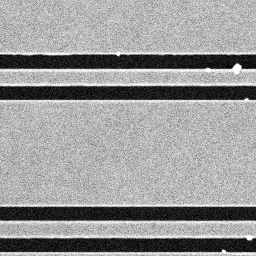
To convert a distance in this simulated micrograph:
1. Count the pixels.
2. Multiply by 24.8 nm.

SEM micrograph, lines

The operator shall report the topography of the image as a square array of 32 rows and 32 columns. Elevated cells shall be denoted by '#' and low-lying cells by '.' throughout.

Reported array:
################################
################################
################################
################################
################################
################################
################################
................................
.............................#..
################################
################################
................................
..............................#.
################################
################################
################################
################################
################################
################################
################################
################################
################################
################################
################################
################################
################################
................................
................................
################################
################################
................................
...........................##...